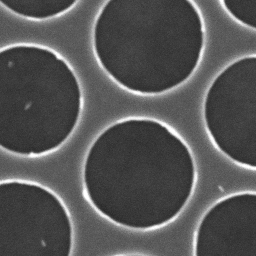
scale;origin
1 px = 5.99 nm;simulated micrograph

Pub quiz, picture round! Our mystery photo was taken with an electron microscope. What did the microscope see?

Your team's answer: holes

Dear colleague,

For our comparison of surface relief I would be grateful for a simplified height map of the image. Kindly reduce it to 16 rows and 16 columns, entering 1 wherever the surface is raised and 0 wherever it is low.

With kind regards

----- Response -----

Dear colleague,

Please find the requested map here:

1000111000001100
1111110000000110
1111110000000111
0001110000001111
0000111000001100
0000011100011000
0000011111111000
0000011111111000
0000110000011000
1001110000001100
1111100000001111
0011100000001111
0000110000001100
0000111000011000
0000111111110000
0000111111110000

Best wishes